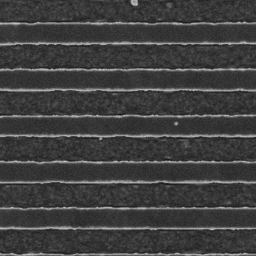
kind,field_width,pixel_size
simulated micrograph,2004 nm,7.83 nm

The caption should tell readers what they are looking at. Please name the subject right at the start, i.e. lines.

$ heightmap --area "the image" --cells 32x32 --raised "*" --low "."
................................
................................
................................
********************************
********************************
***.**********.....*..**...**...
................................
................................
................................
********************************
********************************
................................
................................
................................
.*....**..***..***.*....********
********************************
********************************
................................
................................
................................
********************************
********************************
********************************
................................
................................
................................
********************************
********************************
********************************
................................
................................
................................